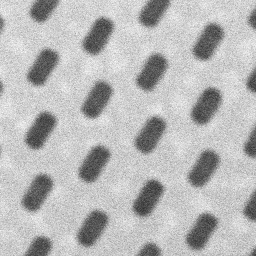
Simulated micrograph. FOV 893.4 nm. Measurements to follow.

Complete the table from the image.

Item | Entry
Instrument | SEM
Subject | a regular array of holes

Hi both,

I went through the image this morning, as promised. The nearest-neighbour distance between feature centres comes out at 219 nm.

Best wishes